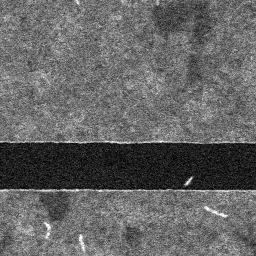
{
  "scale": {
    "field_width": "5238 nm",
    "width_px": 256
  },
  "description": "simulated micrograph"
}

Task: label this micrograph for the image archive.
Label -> one or a few lines or trenches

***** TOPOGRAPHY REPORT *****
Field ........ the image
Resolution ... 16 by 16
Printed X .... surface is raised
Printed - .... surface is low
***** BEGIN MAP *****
XXXXXXXXXXXXXXXX
XXXXXXXXXXXXXXXX
XXXXXXXXXXXXXXXX
XXXXXXXXXXXXXXXX
XXXXXXXXXXXXXXXX
XXXXXXXXXXXXXXXX
XXXXXXXXXXXXXXXX
XXXXXXXXXXXXXXXX
XXXXXXXXXXXXXXXX
----------------
----------------
----------------
XXXXXXXXXXXXXXXX
XXXXXXXXXXXXXXXX
XXXXXXXXXXXXXXXX
XXXXXXXXXXXXXXXX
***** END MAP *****